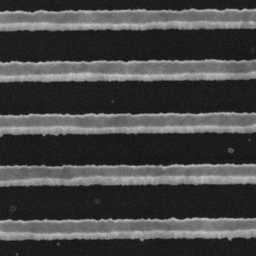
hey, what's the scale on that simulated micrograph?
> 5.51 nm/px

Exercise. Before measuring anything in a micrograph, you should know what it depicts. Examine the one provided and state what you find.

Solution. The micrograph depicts lines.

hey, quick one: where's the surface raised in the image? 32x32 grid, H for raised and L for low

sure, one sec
LLLLLLLLLLLLLLLLLLLLLLLLLLLLLLLL
HHHLHHHHHHHHHHHHHHHHHHHHHHHHHHHH
HHHHHHHHHHHHHHHHHHHHHHHHHHHHHHHH
HHHHHLHHHHHLHLHLHHLLLLLLLLLLLLLL
LLLLLLLLLLLLLLLLLLLLLLLLLLLLLLLL
LLLLLLLLLLLLLLLLLLLLLLLLLLLLLLLL
LLLLLLLLLLLLLLLLLLLLLLLLLLLLLLLL
LLLLLLLLLLLLLLLLLLLLLLLLLHHLLLLL
HHHHHHHHHHHHHHHHHHHHHHHHHHHHHHHH
HHHHHHHHHHHHHHHHHHHHHHHHHHHHHHHH
LLLLLLLLLLLLLLLLLLLLLLLLLLLLLLLL
LLLLLLLLLLLLLLLLLLLLLLLLLLLLLLLL
LLLLLLLLLLLLLLLLLLLLLLLLLLLLLLLL
LLLLLLLLLLLLLLLLLLLLLLLLLLLLLLLL
HHHHHHHHHHHHHHHHHHHHHHHHHHHHHHHH
HHHHHHHHHHHHHHHHHHHHHHHHHHHHHHHH
LLLLLLLLLLHLLLLLLLLLLLLLLLLLLLLL
LLLLLLLLLLLLLLLLLLLLLLLLLLLLLLLL
LLLLLLLLLLLLLLLLLLLLLLLLLLLLLLLL
LLLLLLLLLLLLLLLLLLLLLLLLLLLLLLLL
LLLLLLLLLLLLLLLLLLLLLLLLLLLLLLLL
HHHHHHHHHHHHHHHHHHHHHHHHHHHHHHHH
HHHHHHHHHHHHHHHHHHHHHHHHHHHHHHHH
LLLLLLLLLLLLLLLLLLLLLLLLLLLLLLLL
LLLLLLLLLLLLLLLLLLLLLLLLLLLLLLLL
LLLLLLLLLLLLLLLLLLLLLLLLLLLLLLLL
LLLLLLLLLLLLLLLLLLLLLLLLLLLLLLLL
LLLLLLLLHLHHHHHHHHHHHHHHHHHHHHHH
HHHHHHHHHHHHHHHHHHHHHHHHHHHHHHHH
HHHHHHHHHHHHHHLLHLHLLLLLLLLLLLLL
LLLLLLLLLLLLLLLLLLLLLLLLLLLLLLLL
LLLLLLLLLLLLLLLLLLLLLLLLLLLLLLLL